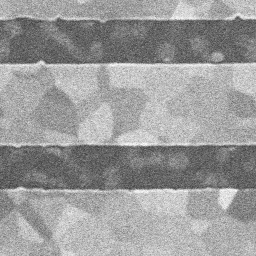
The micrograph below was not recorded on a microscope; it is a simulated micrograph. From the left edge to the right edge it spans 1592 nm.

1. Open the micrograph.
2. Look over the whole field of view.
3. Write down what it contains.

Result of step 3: one or a few lines or trenches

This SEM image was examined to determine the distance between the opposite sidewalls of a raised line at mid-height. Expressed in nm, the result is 498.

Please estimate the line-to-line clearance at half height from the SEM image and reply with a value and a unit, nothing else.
285 nanometers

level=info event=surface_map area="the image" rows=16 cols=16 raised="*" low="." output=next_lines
****************
................
................
................
****************
****************
****************
****************
****************
................
................
................
****************
****************
****************
****************